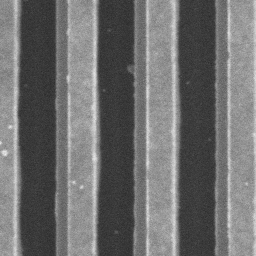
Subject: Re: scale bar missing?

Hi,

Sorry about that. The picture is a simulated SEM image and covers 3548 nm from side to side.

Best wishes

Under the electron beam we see lines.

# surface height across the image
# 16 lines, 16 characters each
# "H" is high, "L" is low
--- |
HLLLHHLLHHHLLLHH
HLLLHHLLHHHLLLHH
HLLLHHLLHHHLLLHH
HLLLHHLLHHHLLLHH
HLLLHHLLHHHLLLHH
HLLLHHLLHHHLLHHH
HLLHHHLLHHHLLLHH
HLLLHHLLHHHLLLHH
HLLLHHLLHHHLLLHH
HLLLHHLLHHHLLLHH
HLLLHHLLHHHLLLHH
HLLLHHLLHHHLLHHH
HLLHHHLLHHHLLHHH
HLLHHHLLHHHLLHHH
HLLLHHLLHHHLLHHH
HLLLHHLLHHHLLHHH